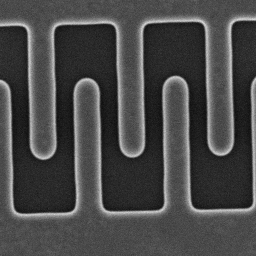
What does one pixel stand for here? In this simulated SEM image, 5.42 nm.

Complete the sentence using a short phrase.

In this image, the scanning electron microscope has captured groups of lines, slits or small figures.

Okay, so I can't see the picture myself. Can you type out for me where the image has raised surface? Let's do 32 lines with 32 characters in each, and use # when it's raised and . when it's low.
################################
################################
##############################..
...####.......####........###...
....###........###........###...
....###........###........###...
....###........###........###...
....###........###........###...
....###........###........###...
....###........###........###...
#...###...##...###...##...###...
#...###..###...###..####..###..#
#...###..###...###..####..###..#
#...###..###...###..####..###...
#...###..####..###..####..###...
#...###..####..###...###..###...
#...###..####..###...###..###...
#...###..####..###...###..###...
#...###..####..###...###..###...
#...##...####...#....###........
#.........###........###........
#.........###........###........
#.........###........###........
#.........###........###........
#.........###........###........
##........###........###........
##.......#####..################
################################
################################
################################
################################
################################